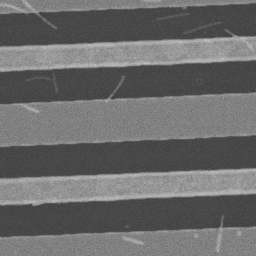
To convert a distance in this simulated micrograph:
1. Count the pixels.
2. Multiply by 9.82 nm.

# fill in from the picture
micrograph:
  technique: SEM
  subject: lines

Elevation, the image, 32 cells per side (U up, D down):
UUUUUUUUUUUUUUUUUUUUUUUUUUUUUDDD
UUUUUDDDDDDDDDDDDDDDDDDDDDDDDDDD
DDDDDDDDDDDDDDDDDDDDDDDDDDDDDDDD
DDDDDDDDDDDDDDDDDDDDDDDDDDDDDDDD
DDDDDDDDDDDDDDDDDDDDDDDDDDDDDDDD
DDDDDDDDDDUUUUUUUUUUUUUUUUUUUUUU
UUUUUUUUUUUUUUUUUUUUUUUUUUUUUUUU
UUUUUUUUUUUUUUUUUUUUUUUUUUUUUUUD
UUUUUUUUDDDDDDDDDDDDDDDDDDDDDDDD
DDDDDDDDDDDDDDDDDDDDDDDDDDDDDDDD
DDDDDDDDDDDDDDDDDDDDDDDDDDDDDDDD
DDDDDDDDDDDDDDDDDDDDDDDDDDDDDDDD
DDDDDDDDDDDDDUUUUUUUUUUUUUUUUUUU
UUUUUUUUUUUUUUUUUUUUUUUUUUUUUUUU
UUUUUUUUUUUUUUUUUUUUUUUUUUUUUUUU
UUUUUUUUUUUUUUUUUUUUUUUUUUUUUUUU
UUUUUUUUUUUUUUUUUUUUUUUUUUUUUUUU
UUUUUUUUUUUUUUUUUUDDDDDDDDDDDDDD
DDDDDDDDDDDDDDDDDDDDDDDDDDDDDDDD
DDDDDDDDDDDDDDDDDDDDDDDDDDDDDDDD
DDDDDDDDDDDDDDDDDDDDDDDDDDDDDDDD
DDDDDDDDDDDDDDDDDDDDDUUUUUUUUUUU
UUUUUUUUUUUUUUUUUUUUUUUUUUUUUUUU
UUUUUUUUUUUUUUUUUUUUUUUUUUUUUUUU
UUUUUUUUUUUUUUUUUUUUUUUUDDDDDDDD
UUDDUDDDDDDDDDDDDDDDDDDDDDDDDDDD
DDDDDDDDDDDDDDDDDDDDDDDDDDDDDDDD
DDDDDDDDDDDDDDDDDDDDDDDDDDDDDDDD
DDDDDDDDDDDDDDDDDDDDDDDDDDDUDDDU
DDDDDUUUUUUUUUUUUUUUUUUUUUUUUUUU
UUUUUUUUUUUUUUUUUUUUUUUUUUUUUUUU
UUUUUUUUUUUUUUUUUUUUUUUUUUUUUUUU